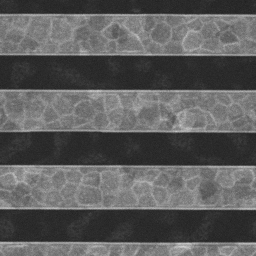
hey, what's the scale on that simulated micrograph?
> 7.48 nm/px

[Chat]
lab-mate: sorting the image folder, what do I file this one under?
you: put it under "one or a few lines or trenches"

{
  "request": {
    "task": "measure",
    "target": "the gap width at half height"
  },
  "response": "265 nanometres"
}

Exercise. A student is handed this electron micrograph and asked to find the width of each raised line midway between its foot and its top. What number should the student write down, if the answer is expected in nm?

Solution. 297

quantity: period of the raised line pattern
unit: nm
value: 570